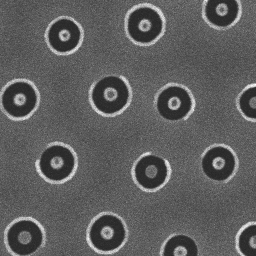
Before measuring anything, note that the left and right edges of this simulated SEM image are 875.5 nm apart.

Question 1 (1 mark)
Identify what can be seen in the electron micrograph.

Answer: a regular array of ring-shaped grooves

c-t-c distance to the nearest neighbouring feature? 252 nm